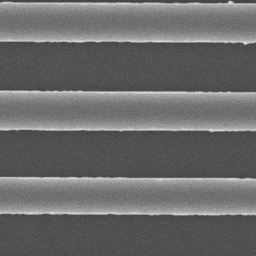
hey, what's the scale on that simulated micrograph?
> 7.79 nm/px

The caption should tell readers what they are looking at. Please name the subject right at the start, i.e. lines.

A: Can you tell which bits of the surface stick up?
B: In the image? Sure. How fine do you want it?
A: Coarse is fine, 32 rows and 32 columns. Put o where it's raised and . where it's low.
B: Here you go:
oooooooooooooooooooooooooooooooo
oooooooooooooooooooooooooooooooo
oooooooooooooooooooooooooooooooo
oooooooooooooooooooooooooooooooo
oooooooooooooooooooooooooooooooo
................................
................................
................................
................................
................................
................................
ooooooooooo.....................
oooooooooooooooooooooooooooooooo
oooooooooooooooooooooooooooooooo
oooooooooooooooooooooooooooooooo
oooooooooooooooooooooooooooooooo
................................
................................
................................
................................
................................
................................
oooooooooooooooooooooooooooooooo
oooooooooooooooooooooooooooooooo
oooooooooooooooooooooooooooooooo
oooooooooooooooooooooooooooooooo
oooooooooooooooooooooooooooooooo
................................
................................
................................
................................
................................